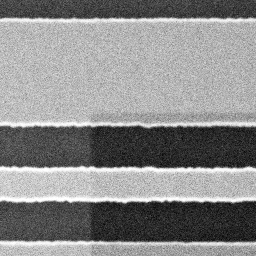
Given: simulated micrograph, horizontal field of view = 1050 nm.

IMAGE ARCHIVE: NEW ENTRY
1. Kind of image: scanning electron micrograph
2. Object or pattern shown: lines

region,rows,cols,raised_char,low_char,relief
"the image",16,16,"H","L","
LLLLLLLLLLLLLLLL
HHHHHHHHHHHHHHHH
HHHHHHHHHHHHHHHH
HHHHHHHHHHHHHHHH
HHHHHHHHHHHHHHHH
HHHHHHHHHHHHHHHH
HHHHHHHHHHHHHHHH
HHHHHHHHHHHHHHHH
LLLLLLLLLLLLLLLL
LLLLLLLLLLLLLLLL
LLLLLHLLLLLLLLLL
HHHHHHHHHHHHHHHH
HHHHHHHHHHHHHHHH
LLLLLLLLLLLLLLLL
LLLLLLLLLLLLLLLL
HHHHHHHHHHHHHHHH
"